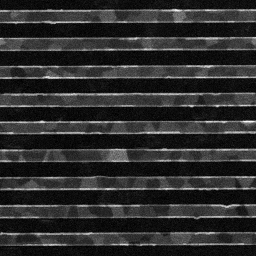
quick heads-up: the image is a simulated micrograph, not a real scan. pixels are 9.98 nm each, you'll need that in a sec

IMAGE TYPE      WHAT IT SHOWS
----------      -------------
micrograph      parallel lines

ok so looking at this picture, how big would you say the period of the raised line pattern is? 278 nanometres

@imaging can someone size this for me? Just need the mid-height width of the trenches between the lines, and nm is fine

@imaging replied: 152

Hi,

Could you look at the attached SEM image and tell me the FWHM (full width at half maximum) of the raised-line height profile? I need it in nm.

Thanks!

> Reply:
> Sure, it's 130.